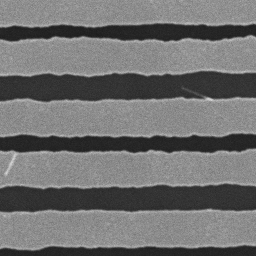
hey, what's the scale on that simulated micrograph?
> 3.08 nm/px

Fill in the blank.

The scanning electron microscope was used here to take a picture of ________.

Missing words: lines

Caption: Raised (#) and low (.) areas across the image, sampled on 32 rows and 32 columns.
################################
################################
################################
................................
...............................#
################################
################################
################################
################################
..........##....................
................................
................................
..##.........##...##############
################################
################################
################################
################################
................................
................................
################################
################################
################################
################################
.....#....#.....................
................................
................................
....############.###############
################################
################################
################################
################################
................................